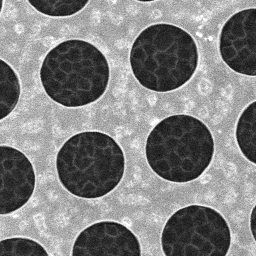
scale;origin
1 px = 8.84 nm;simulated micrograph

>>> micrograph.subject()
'holes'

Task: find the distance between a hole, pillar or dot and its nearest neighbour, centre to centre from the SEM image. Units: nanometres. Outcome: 801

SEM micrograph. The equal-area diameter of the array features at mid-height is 0.602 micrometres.